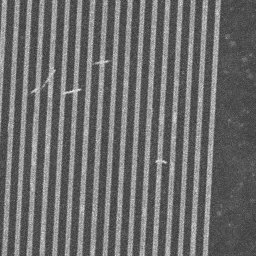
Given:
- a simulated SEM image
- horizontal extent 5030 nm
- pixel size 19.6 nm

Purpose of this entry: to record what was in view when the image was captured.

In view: parallel lines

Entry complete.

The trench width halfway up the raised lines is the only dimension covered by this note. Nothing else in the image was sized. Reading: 167 nm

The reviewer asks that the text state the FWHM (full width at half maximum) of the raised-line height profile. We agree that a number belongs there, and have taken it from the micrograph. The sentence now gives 4.24 pixels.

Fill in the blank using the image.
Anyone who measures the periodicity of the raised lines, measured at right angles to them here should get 246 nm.